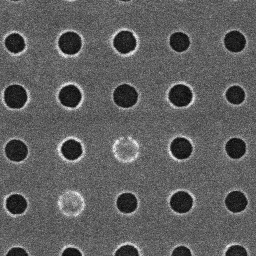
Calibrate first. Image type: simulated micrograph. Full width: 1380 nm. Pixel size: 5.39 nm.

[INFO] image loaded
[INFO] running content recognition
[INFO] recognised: a regular array of holes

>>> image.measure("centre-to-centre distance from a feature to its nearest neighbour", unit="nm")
288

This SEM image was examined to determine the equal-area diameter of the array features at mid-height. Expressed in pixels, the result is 22.7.